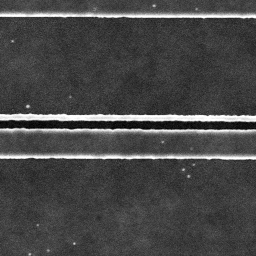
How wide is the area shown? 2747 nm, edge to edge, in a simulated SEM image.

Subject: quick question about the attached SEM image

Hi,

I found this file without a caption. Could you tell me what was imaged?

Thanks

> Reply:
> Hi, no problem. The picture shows lines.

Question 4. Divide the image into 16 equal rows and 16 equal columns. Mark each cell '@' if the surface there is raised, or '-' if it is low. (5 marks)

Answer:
@@@@@@@@@@@@@@@@
----------------
----------------
----------------
----------------
----------------
----------------
@@@@@@@@@@@@@@@@
@@@@@@@@@@@@@@@@
@@@@@@@@@@@@@@@@
----------------
----------------
----------------
----------------
----------------
----------------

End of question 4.